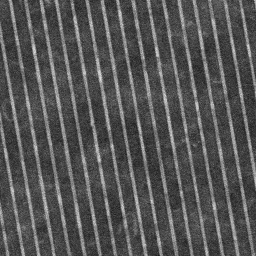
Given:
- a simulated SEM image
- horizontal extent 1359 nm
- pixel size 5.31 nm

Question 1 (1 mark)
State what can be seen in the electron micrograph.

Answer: parallel lines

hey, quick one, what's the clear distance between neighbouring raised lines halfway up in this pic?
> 12.9 px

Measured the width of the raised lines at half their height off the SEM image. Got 11.1 nm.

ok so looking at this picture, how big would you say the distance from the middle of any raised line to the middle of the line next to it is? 80.3 nm